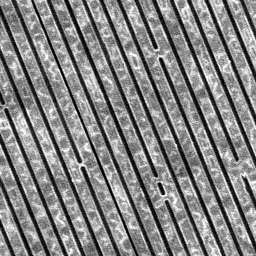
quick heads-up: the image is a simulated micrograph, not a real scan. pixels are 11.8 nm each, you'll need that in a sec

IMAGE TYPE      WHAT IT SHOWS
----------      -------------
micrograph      parallel lines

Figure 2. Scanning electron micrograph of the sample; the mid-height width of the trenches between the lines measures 52 nanometers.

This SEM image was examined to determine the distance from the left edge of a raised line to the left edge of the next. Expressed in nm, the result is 192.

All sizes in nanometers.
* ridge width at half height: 138